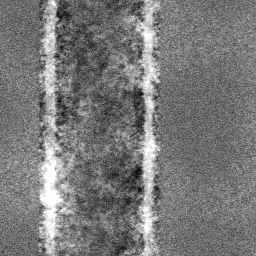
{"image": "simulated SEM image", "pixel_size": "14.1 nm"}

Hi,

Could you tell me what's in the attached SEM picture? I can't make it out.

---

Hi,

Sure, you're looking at one or a few lines or trenches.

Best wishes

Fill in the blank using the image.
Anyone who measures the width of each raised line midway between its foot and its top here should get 1380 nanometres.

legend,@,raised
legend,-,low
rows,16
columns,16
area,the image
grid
---@@@@@@-------
---@@@@@@-------
---@@@@@@-------
---@@@@@@-------
---@@@@@@-------
---@@@@@@-------
---@@@@@@-------
---@@@@@@-------
---@@@@@@-------
---@@@@@@-------
---@@@@@@-------
---@@@@@@-------
---@@@@@@-------
---@@@@@@-------
---@@@@@@-------
---@@@@@@-------